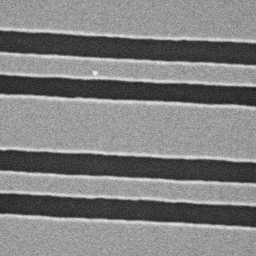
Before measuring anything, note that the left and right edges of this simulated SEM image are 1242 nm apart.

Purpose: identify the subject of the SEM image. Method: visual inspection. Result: lines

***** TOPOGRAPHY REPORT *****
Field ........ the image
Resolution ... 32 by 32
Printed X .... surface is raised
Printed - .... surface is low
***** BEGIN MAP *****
XXXXXXXXXXXXXXXXXXXXXXXXXXXXXXXX
XXXXXXXXXXXXXXXXXXXXXXXXXXXXXXXX
XXXXXXXXXXXXXXXXXXXXXXXXXXXXXXXX
XXXXXXXXXXXXXXXXXXXXXXXXXXXXXXXX
-------------XXXXXXXXXXXXXXXXXXX
--------------------------------
--------------------------------
XXXXXXXXXXXXXXXX----------------
XXXXXXXXXXXXXXXXXXXXXXXXXXXXXXXX
----XXXXXXXXXXXXXXXXXXXXXXXXXXXX
--------------------------XXXXXX
--------------------------------
XXXXXXXXXXXXXX------------------
XXXXXXXXXXXXXXXXXXXXXXXXXXXXXXXX
XXXXXXXXXXXXXXXXXXXXXXXXXXXXXXXX
XXXXXXXXXXXXXXXXXXXXXXXXXXXXXXXX
XXXXXXXXXXXXXXXXXXXXXXXXXXXXXXXX
XXXXXXXXXXXXXXXXXXXXXXXXXXXXXXXX
XXXXXXXXXXXXXXXXXXXXXXXXXXXXXXXX
------------------XXXXXXXXXXXXXX
--------------------------------
X-------------------------------
XXXXXXXXXXXXXXXXXXXX------------
XXXXXXXXXXXXXXXXXXXXXXXXXXXXXXXX
--------XXXXXXXXXXXXXXXXXXXXXXXX
---------------------------XXXXX
--------------------------------
XXXXXXXXXXXXXX------------------
XXXXXXXXXXXXXXXXXXXXXXXXXXXXXXXX
XXXXXXXXXXXXXXXXXXXXXXXXXXXXXXXX
XXXXXXXXXXXXXXXXXXXXXXXXXXXXXXXX
XXXXXXXXXXXXXXXXXXXXXXXXXXXXXXXX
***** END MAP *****